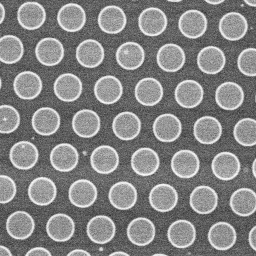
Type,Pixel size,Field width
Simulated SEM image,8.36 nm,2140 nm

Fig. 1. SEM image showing an array of small figures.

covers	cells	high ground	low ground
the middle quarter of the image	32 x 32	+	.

.....+++......+++++.....+++++...
.........................+++....
................................
+++......++++...................
++++....++++++.....+++++......++
++++....++++++....++++++....++++
++++....++++++....+++++++...++++
++++....++++++....+++++++...++++
+++.....++++++....++++++....++++
.........++++......+++++.....+++
..............................++
................................
...+++++......+++...............
..+++++++....++++++....+++++....
..+++++++...+++++++....++++++...
..+++++++...+++++++...+++++++...
...+++++....+++++++...+++++++...
...+++++.....+++++.....++++++...
..............+++......+++++....
................................
++..............................
+++.....+++++......+++..........
+++....++++++.....+++++.....++++
+++....+++++++...++++++....+++++
+++....++++++....+++++++...+++++
+++....++++++....+++++++...+++++
+.......++++......+++++....+++++
...................+++......++++
................................
...++++.........................
..+++++.....+++++......+++......
.+++++++....++++++....++++++....